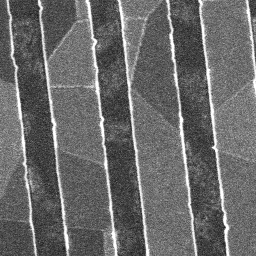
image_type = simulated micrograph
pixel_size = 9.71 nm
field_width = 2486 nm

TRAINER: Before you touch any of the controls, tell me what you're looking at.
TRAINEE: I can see one or a few lines or trenches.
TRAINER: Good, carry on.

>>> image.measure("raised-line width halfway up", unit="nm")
479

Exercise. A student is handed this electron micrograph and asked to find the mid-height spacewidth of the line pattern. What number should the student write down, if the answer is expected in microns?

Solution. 0.299